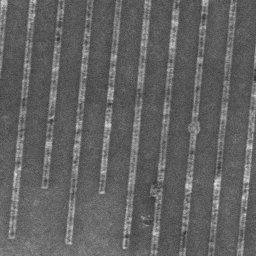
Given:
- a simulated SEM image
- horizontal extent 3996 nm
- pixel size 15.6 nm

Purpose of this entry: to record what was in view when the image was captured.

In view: parallel lines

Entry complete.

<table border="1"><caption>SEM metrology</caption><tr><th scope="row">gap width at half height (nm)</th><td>375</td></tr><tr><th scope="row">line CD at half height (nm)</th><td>70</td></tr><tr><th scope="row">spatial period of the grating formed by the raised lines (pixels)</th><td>28.6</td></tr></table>